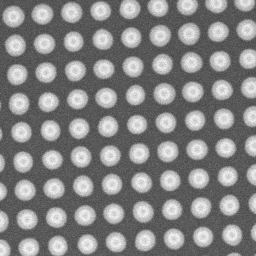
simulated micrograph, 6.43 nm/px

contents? an array of small figures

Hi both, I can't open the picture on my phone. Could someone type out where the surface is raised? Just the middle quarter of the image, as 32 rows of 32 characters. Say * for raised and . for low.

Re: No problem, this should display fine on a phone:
.****..*****...*****..*****..***
*****..*****...*****..*****...**
*****...****....***.....**......
.****....**.....................
................................
.................**....****...**
...*.....***....****...*****..**
.*****..*****...****..******..**
.*****..*****...****...*****..**
.*****..*****...***....****.....
..***....***....................
................................
........................***....*
..........**.....***...*****..**
..****...****...*****..*****..**
.*****...****...*****..*****...*
.*****...****...****....***.....
..****...****...................
...**...........................
.........................**.....
...........*.....***....****...*
..****...*****..*****..*****...*
..*****..*****..*****..*****...*
..*****..*****...****...****....
..****....***....***.....*......
...***..........................
................................
..................***....***...*
...***....****...*****..*****..*
..*****...****...*****..*****..*
..*****...****...*****..*****...
...****...****....***....***....